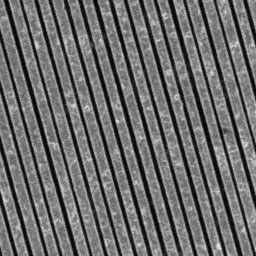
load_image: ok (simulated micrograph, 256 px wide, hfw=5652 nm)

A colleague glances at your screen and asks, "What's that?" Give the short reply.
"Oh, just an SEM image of parallel lines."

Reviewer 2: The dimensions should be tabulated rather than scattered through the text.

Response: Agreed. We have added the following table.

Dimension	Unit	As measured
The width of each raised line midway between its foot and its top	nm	208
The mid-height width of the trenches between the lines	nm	106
